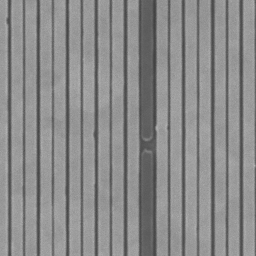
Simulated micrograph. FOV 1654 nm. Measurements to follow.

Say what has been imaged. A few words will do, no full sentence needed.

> parallel lines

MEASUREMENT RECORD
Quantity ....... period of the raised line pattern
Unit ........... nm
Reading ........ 93.7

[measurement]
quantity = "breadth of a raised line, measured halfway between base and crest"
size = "11.6 px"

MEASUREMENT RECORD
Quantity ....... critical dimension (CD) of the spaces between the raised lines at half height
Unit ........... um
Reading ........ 0.025